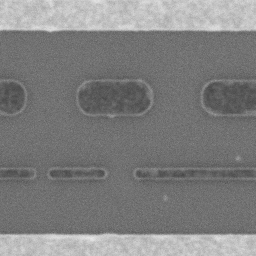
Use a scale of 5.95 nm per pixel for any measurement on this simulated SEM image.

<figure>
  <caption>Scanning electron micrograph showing one or a few lines or trenches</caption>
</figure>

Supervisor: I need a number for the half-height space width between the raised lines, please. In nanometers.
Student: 337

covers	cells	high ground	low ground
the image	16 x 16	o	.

oooooooooooooooo
oooooooooooooooo
................
................
................
o....oooo....ooo
oo...oooo....ooo
................
................
................
................
................
................
................
................
oooooooooooooooo